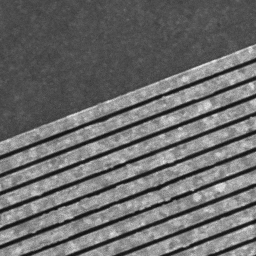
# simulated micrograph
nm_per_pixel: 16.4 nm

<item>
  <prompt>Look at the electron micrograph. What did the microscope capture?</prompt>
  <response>parallel lines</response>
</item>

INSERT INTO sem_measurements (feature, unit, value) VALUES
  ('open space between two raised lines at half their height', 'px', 4.67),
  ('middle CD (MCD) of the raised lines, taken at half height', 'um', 0.199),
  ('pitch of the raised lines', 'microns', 0.273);